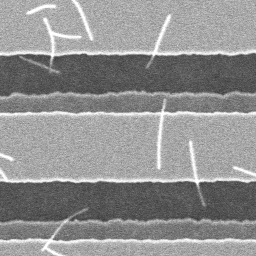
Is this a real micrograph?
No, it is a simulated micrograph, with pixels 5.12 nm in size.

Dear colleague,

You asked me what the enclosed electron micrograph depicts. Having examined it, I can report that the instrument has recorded lines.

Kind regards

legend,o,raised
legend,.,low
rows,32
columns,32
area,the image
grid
oooooooooooooooooooooooooooooooo
oooooooooooooooooooooooooooooooo
oooooooooooooooooooooooooooooooo
oooooooooooooooooooooooooooooooo
oooooooooooooooooooooooooooooooo
oooooooooooooooooooooooooooooooo
oooooooooooooooooooooooooooooooo
................................
................................
................................
................................
................................
ooooooooooooo.oooooooooooooooooo
oooooooooooo...ooooooooooooooooo
oooooooooooooooooooooooooooooooo
oooooooooooooooooooooooooooooooo
oooooooooooooooooooooooooooooooo
oooooooooooooooooooooooooooooooo
oooooooooooooooooooooooooooooooo
oooooooooooooooooooooooooooooooo
oooooooooooooooooooooooooooooooo
oooooooooooooooooooooooooooooooo
oooooooooooooooooooooooooooooooo
................................
................................
................................
................................
................................
oooooooooooooooooooooooooooooooo
oooooooooooooooooooooooooooooooo
oooooooooooooooooooooooooooooooo
oooooooooooooooooooooooooooooooo